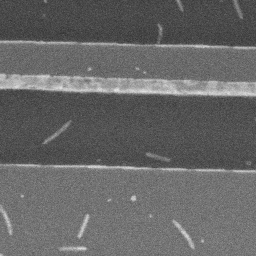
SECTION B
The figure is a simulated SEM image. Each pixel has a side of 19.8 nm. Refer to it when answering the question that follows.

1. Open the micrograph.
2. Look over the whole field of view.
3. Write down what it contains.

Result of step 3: lines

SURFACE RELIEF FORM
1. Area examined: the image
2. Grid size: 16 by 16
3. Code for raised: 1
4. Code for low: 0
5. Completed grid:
0000000000000000
0000000000000000
0000000000000000
1111111111111111
1111111111111111
0111111111111111
0000000000000000
0000000000000000
0000000000000000
0000000000000000
1111111000000000
1111111111111111
1111111111111111
1111111111111111
1111111111111111
1111111111111111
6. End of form